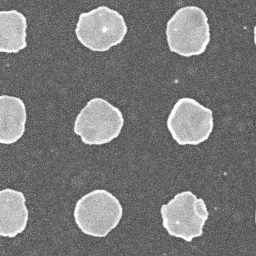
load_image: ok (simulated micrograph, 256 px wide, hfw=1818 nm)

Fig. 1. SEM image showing raised bodies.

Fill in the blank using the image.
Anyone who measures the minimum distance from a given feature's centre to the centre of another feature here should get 618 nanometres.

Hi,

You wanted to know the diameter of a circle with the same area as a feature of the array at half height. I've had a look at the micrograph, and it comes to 322 nm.